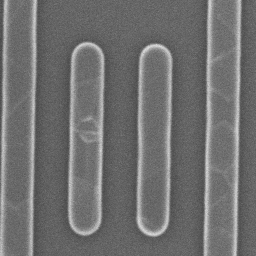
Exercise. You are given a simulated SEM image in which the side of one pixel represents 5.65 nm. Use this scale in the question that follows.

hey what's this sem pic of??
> groups of lines, slits or small figures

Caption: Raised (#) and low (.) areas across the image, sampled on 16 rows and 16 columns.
##...........##.
##...........##.
##...........##.
##...#...##..##.
##..##...##..##.
##..##...##..##.
##..##...##..##.
##..##...##..##.
##..##...##..##.
##..##...##..##.
##..##...##..##.
##..##...##..##.
##..##...##..##.
##..##...##..##.
##...#...#...##.
##...........##.